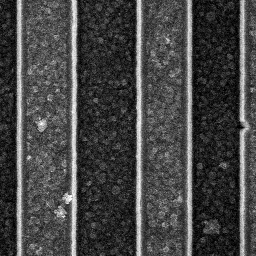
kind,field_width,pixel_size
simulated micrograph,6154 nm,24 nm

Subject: one or a few lines or trenches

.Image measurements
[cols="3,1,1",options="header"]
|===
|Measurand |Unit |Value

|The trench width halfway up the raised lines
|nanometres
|1400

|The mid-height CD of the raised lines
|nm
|1270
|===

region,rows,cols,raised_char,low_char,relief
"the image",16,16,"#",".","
.####....###...#
.####....###...#
.####....###...#
.####....###...#
.####....###...#
.####....###...#
.####....###...#
.####....###...#
.####....###...#
.####....###...#
.####....###...#
.####....###...#
.####....###...#
.####....###...#
.####....###...#
.####....###...#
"